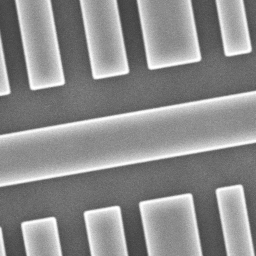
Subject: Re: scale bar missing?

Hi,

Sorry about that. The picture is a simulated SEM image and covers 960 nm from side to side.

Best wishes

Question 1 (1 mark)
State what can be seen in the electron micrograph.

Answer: groups of lines, slits or small figures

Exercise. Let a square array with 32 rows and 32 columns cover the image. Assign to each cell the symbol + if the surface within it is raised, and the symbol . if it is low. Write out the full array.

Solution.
..++++....+++++..+++++++...+++..
..++++....+++++..+++++++...++++.
..+++++...+++++...++++++...++++.
...++++....++++...++++++....+++.
...++++....++++...+++++++...+++.
...++++....++++...+++++++...+++.
...++++....+++++..+++++++...+++.
+..+++++...+++++..+++++++.......
+..+++++....++++................
+...++++....+...................
+...++++........................
+...............................
..........................++++++
....................++++++++++++
...............+++++++++++++++++
.........+++++++++++++++++++++++
...+++++++++++++++++++++++++++++
++++++++++++++++++++++++++++++++
+++++++++++++++++++++++++++.....
++++++++++++++++++++++..........
++++++++++++++++................
++++++++++......................
++++............................
............................++..
......................++...+++..
..................++++++...++++.
...........++++...++++++....+++.
.....++....++++...++++++....+++.
...++++....++++...+++++++...+++.
...++++....++++...+++++++...+++.
...++++....+++++..+++++++...+++.
+..+++++...+++++...++++++...++++